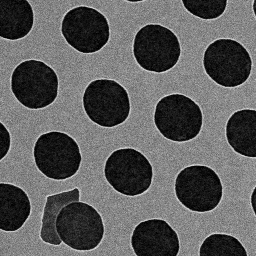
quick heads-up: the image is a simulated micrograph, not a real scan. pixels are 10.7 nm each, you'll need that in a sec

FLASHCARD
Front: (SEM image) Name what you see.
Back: a regular array of holes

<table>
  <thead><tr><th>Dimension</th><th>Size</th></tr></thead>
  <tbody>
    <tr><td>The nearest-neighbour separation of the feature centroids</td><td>772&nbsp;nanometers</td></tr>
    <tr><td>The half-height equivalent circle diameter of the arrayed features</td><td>508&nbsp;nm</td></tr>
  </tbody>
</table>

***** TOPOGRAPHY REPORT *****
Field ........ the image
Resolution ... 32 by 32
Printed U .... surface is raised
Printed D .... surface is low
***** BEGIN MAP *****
DDDDUUUUUUUUUUUUUUUUUUUDDDDDUUUU
DDDDUUUUUDDDUUUUUUUUUUUUDDDDUUUU
DDDDUUUUDDDDDUUUUUUUUUUUUUUUUUUU
DDDDUUUUDDDDDDUUUUDDDUUUUUUUUUUU
DDDUUUUUDDDDDDUUUDDDDDUUUUUUUUUU
UUUUUUUUUDDDDUUUUDDDDDUUUUDDDDUU
UUUUUUUUUUDDUUUUUDDDDDDUUUDDDDDU
UUUUUUUUUUUUUUUUUDDDDDUUUDDDDDDU
UUDDDDUUUUUUUUUUUUDDDUUUUUDDDDDU
UUDDDDDUUUUUUUUUUUUUUUUUUUDDDDDU
UDDDDDDUUUUDDDDUUUUUUUUUUUUDDDUU
UUDDDDDUUUUDDDDDUUUUUUUUUUUUUUUU
UUDDDDDUUUDDDDDDUUUUDDDDUUUUUUUU
UUUUDUUUUUUDDDDDUUUDDDDDDUUUUUUU
UUUUUUUUUUUDDDDDUUUDDDDDDUUUUDDD
UUUUUUUUUUUUDDDUUUUDDDDDDUUUDDDD
DUUUUUUUUUUUUUUUUUUUDDDDDUUUDDDD
DUUUUDDDDUUUUUUUUUUUUDDDUUUUDDDD
DUUUDDDDDDUUUUUUUUUUUUUUUUUUUDDD
DUUUDDDDDDUUUUDDDDUUUUUUUUUUUUUD
UUUUDDDDDDUUUDDDDDDUUUUUUUUUUUUU
UUUUUDDDDDUUUDDDDDDUUUUDDDDUUUUU
UUUUUUUUUUUUUDDDDDDUUUDDDDDUUUUU
DDUUUUUUUUUUUUDDDDDUUUDDDDDDUUUU
DDDUUUDDDDUUUUUUUUUUUUDDDDDDUUUD
DDDDUUDDDDDUUUUUUUUUUUUDDDDUUUUD
DDDDUDDDDDDDUUUUUUUUUUUUUUUUUUUU
DDDUUDDDDDDDDUUUUUUDUUUUUUUUUUUU
DDUUUDDDDDDDDUUUUDDDDUUUUUUUUUUU
UUUUUDDDDDDDDUUUUDDDDDUUUUDDDUUU
UUUUUUDUDDDDUUUUDDDDDDUUUDDDDDUU
UUUUUUUUUUUUUUUUUDDDDDUUUDDDDDDU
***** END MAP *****